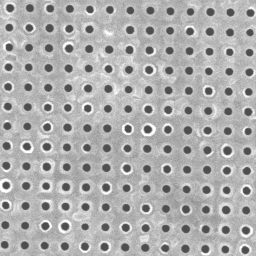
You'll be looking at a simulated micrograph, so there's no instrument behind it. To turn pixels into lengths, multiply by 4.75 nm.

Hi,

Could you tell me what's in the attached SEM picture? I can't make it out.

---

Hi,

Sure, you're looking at a regular array of holes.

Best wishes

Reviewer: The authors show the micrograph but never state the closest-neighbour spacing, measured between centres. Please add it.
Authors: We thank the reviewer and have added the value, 93.3 nm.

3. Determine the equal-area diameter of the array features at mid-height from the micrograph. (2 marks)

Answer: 36.8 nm